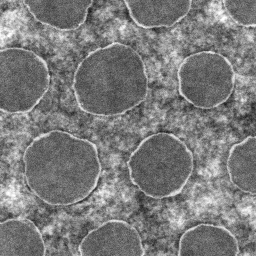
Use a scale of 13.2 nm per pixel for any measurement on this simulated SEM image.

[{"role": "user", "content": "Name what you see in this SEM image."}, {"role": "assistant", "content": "raised bodies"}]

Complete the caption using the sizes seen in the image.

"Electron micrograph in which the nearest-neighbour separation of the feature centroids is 1280 nm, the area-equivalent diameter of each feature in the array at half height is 908 nm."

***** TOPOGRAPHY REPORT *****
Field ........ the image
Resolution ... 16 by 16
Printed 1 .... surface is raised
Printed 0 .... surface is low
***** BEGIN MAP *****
0011110011110011
0001100001100001
0000000000000000
1100011110001100
1110011110011110
1110011110011110
1100011110001100
0000000000000000
0001100000100000
0011110011110011
0011110011110011
0011110011110001
0001100000000000
0000000000000000
1100001110001100
1110011110011110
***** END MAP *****